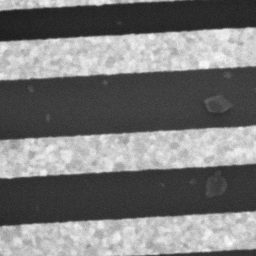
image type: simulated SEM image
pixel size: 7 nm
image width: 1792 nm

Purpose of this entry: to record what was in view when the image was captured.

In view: lines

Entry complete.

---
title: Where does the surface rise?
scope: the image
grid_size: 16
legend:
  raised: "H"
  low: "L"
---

HHLLLLLLLLLLLLLL
LLLLLLLLLLLLLLLL
LLLHHHHHHHHHHHHH
HHHHHHHHHHHHHHHH
HHHHHHHHHLLLLLLL
LLLLLLLLLLLLLLLL
LLLLLLLLLLLLLLLL
LLLLLLLLLLLLLLLL
LLLLLHHHHHHHHHHH
HHHHHHHHHHHHHHHH
HHHHHHHHHHHLLLLL
LLLLLLLLLLLLLLLL
LLLLLLLLLLLLLLLL
LLLLLLLLLLLLHHHH
HHHHHHHHHHHHHHHH
HHHHHHHHHHHHHHHH